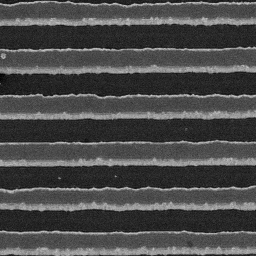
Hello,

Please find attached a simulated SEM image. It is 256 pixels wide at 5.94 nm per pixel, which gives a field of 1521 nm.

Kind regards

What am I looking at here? lines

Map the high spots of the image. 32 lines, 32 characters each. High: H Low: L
LLHHHHHHHHHHHHHLLLHHHHHHHHHHHHHH
HHHHHHHHHHHHHHHHHHHHHHHHHHHHHHHH
HHHHHHHHHHHHHHHHHHHHHHHHHHHHHHHH
LLLLLLLLLLLLLLLLLLLLLLLLLLLLLLLL
LLLLLLLLLLLLLLLLLLLLLLLLLLLLLLLL
LLLLLLLLLLLLLLLLLLLLLLLLLLLLLLLL
HHHHHHHHHHHHHHHHHHHHHHHHHHHHHHHH
HHHHHHHHHHHHHHHHHHHHHHHHHHHHHHHH
HHHHHHHHHHHHHHHHHHHHHHHHHHHHHHHH
LLLLLLLLLLLLLLLLLLLLLLLLLLLLLLLL
LLLLLLLLLLLLLLLLLLLLLLLLLLLLLLLL
LLLLLLLLLLLLLLLLLLLLLLLLLLLLLLLL
HHHHHHHHHHHHHHHHHHHHHHHHHHHHHHHH
HHHHHHHHHHHHHHHHHHHHHHHHHHHHHHHH
HHHHHHHHHHHHHHHHHHHHHHHHHHHHHHLL
LLLLLLLLLLLLLLLLLLLLLLLLLLLLLLLL
LLLLLLLLLLLLLLLLLLLLLLLLLLLLLLLL
LLLLLLLLLLLLLLLLLLLLLLLLLLLLLLLL
HHHHHHHHHHHHHHHHHHHHHHHHHHHHHHHH
HHHHHHHHHHHHHHHHHHHHHHHHHHHHHHHH
HHHHHHHHHHLLLHLLLLLLHHHLLLLLLLLL
LLLLLLLLLLLLLLLLLLLLLLLLLLLLLLLL
LLLLLLLLLLLLLLLLLLLLLLLLLLLLLLLL
LLLLLLLLLLLLLHLLLLHLLLLLLLLLLHLH
HHHHHHHHHHHHHHHHHHHHHHHHHHHHHHHH
HHHHHHHHHHHHHHHHHHHHHHHHHHHHHHHH
LLLLLLLLLLLLLLLLLLLLLLLLLLLLLLLL
LLLLLLLLLLLLLLLLLLLLLLLLLLLLLLLL
LLLLLLLLLLLLLLLLLLLLLLLLLLLLLLLL
HHHHHHHHHHHHHHHHHHHHHHHHHHHHHHHH
HHHHHHHHHHHHHHHHHHHHHHHHHHHHHHHH
HHHHHHHHHHHHHHHHHHHHHHHHHHHHHHHL